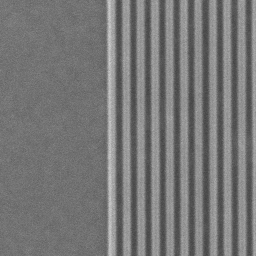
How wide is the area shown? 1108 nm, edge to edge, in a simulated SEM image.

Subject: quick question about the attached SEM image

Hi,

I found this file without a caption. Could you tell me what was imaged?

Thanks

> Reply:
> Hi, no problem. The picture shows parallel lines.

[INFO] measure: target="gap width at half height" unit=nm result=34.6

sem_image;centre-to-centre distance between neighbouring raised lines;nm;62.5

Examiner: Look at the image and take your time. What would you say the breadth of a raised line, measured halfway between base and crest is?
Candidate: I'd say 6.26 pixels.